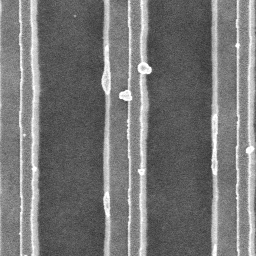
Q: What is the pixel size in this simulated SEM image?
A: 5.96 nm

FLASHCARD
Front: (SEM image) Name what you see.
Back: lines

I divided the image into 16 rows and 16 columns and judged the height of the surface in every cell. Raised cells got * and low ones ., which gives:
**.....**....***
**.....**....***
**.....**....***
**.....**....***
**....***....***
**....***....***
**.....**....***
**.....**....***
**.....**....***
**.....**....***
**.....**....***
**.....**.....**
**....***....***
**.....**....***
**.....**....***
**.....**....***